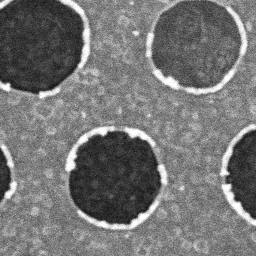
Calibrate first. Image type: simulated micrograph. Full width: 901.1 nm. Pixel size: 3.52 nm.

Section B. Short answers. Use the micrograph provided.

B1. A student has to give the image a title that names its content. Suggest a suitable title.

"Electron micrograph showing holes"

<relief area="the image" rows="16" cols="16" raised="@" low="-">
----@@@@@@@--@@@
-----@@@@@---@@@
-----@@@@@----@@
-----@@@@@---@@@
-----@@@@@@@@@@@
@--@@@@@@@@@@@@@
@@@@@@@@@@@@@@@@
@@@@@@@@@@@@@@@@
@@@@@@--@@@@@@@-
@@@@@-----@@@@--
-@@@@-----@@@@--
-@@@------@@@@--
@@@@@-----@@@@@-
@@@@@@---@@@@@@@
@@@@@@@@@@@@@@@@
@@@@@@@@@@@@@@@@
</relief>